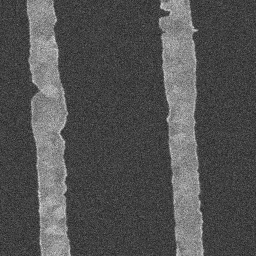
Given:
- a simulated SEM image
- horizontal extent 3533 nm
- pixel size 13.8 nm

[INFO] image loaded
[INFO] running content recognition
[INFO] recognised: one or a few lines or trenches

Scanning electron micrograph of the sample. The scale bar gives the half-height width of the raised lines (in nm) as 365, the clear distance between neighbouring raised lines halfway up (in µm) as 1.47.